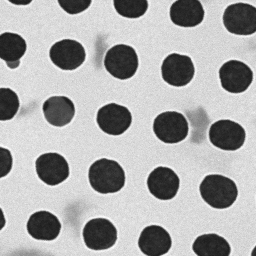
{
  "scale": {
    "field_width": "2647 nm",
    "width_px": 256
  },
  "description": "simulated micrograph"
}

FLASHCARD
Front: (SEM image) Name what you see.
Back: a regular array of holes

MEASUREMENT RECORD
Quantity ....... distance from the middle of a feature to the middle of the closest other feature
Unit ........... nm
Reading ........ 579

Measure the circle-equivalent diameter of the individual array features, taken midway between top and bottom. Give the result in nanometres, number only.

349